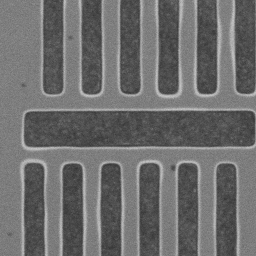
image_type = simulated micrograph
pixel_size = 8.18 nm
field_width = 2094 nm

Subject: groups of lines, slits or small figures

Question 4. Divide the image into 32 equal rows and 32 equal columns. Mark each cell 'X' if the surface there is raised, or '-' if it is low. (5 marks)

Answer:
XXXXX---XX---XX---XX---XX--XX---
XXXXX---XX---XX---XX---XX--XX---
XXXXX---XX---XX---XX---XX--XX---
XXXXX---XX---XX---XX--XXX--XX---
XXXXX---XX---XX---XX--XXX--XX---
XXXXX---XX---XX---XX--XXX--XX---
XXXXX---XX---XX---XX--XX---XX---
XXXXX---XX---XX---XX--XX---XX---
XXXXX---XX---XX---XX--XX---XX---
XXXXX---XX---XX---XX---X---XX---
XXXXX---XX---XX---XX---X---XX---
XXXXXX--XX---XX--XXX--XXX--XXX--
XXXXXXXXXXXXXXXXXXXXXXXXXXXXXXXX
XXXXXXXXXXXXXXXXXXXXXXXXXXXXXXXX
XXX-----------------------------
XXX-----------------------------
XXX-----------------------------
XXX-----------------------------
XXXX--XXXX-XXXX--XXXXXXXX--XXXXX
XXXXXXXXXXXXXXXXXXXXXXXXXXXXXXXX
XXX--XXX--XXX--XXX--XXX-XXXX-XXX
XXX---XX--XXX--XX---XX---XX---XX
XXX---XX--XXX--XX---XX---XX---XX
XXX---XX--XXX--XX---XX---XX---XX
XXX---XX--XXX--XX---XX---XX---XX
XXX---XX---X---XX---XX---XX---XX
XXX---XX---X---XX---XX---XX---XX
XXX---XX---X---XX---XX---XX---XX
XXX---XX---XX--XX---XX---XX---XX
XXX---XX---XX--XX---XX---XX---XX
XXX---XX--XXX--XX---XX---XX---XX
XXX---XX--XXX--XX---XX---XX---XX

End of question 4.